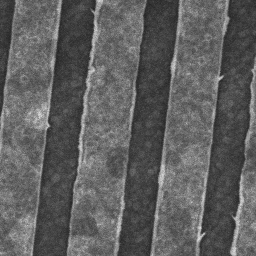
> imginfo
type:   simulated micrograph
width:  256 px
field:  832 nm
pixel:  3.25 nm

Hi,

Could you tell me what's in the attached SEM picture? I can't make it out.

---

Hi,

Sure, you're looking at one or a few lines or trenches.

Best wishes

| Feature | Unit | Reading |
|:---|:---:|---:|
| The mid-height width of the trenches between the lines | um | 0.111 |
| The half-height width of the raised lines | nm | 154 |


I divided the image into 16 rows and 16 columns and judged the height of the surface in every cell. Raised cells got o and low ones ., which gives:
.ooo..ooo..ooo..
.ooo..ooo..ooo..
.ooo..ooo..ooo..
.oo...ooo..ooo..
ooo..oooo..ooo..
ooo..ooo...ooo..
ooo..ooo...oo...
ooo..ooo..ooo...
ooo..ooo..ooo..o
ooo..ooo..ooo..o
ooo..ooo..ooo..o
oo...ooo..ooo..o
oo...ooo..ooo..o
oo..oooo..ooo..o
oo..oooo..ooo..o
oo..ooo..ooo..oo